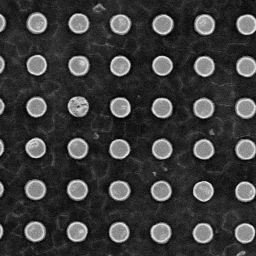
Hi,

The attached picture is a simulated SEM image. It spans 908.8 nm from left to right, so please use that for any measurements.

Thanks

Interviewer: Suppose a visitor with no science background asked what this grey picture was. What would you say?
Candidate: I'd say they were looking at a regular array of raised bodies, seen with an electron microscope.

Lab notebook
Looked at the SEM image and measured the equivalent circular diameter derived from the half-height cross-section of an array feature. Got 70.7 nm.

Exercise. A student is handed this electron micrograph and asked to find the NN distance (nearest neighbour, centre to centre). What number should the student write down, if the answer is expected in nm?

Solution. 147